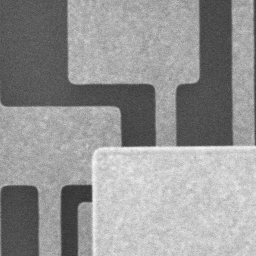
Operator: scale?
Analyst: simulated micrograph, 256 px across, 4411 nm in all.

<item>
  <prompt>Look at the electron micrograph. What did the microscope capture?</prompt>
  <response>wiring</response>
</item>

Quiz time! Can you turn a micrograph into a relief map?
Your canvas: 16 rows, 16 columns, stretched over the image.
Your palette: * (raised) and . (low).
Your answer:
................
................
................
................
................
................
................
................
................
......**********
......**********
......**********
......**********
......**********
......**********
......**********